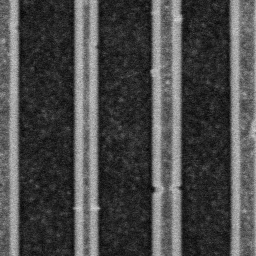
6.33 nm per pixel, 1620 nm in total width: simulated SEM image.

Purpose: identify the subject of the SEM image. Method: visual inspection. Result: one or a few lines or trenches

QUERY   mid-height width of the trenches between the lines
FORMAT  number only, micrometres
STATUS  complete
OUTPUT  0.397